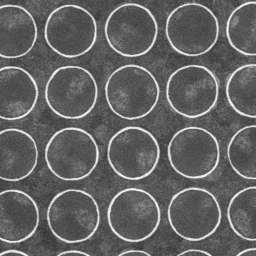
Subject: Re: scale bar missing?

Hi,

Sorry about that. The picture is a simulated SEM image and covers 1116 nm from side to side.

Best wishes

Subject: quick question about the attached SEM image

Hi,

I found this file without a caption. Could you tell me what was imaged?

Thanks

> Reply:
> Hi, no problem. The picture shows a regular array of holes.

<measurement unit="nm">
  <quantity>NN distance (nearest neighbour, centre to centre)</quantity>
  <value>263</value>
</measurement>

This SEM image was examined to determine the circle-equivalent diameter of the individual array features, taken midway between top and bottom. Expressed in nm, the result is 220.